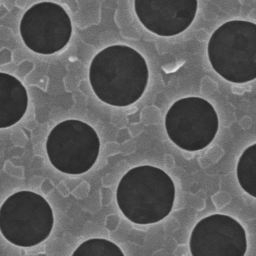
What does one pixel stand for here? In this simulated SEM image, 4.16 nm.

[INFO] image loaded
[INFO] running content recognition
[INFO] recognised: holes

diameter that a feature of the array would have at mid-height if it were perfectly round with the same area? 225 nanometers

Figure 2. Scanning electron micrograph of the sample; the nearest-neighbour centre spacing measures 84.9 px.